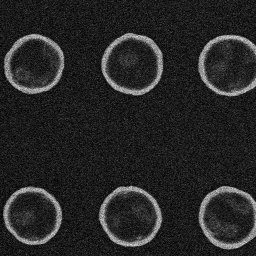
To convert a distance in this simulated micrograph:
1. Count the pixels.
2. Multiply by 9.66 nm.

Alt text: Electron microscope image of raised bodies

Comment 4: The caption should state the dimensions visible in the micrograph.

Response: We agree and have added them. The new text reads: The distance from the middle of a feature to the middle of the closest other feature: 948 nanometres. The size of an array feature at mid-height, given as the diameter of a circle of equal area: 545 nm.